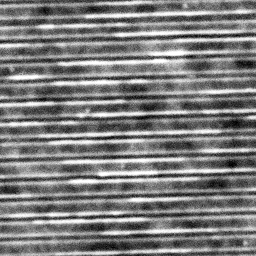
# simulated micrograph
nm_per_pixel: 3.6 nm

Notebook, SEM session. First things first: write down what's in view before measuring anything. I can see parallel lines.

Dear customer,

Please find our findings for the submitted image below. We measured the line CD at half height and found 0.0518 micrometres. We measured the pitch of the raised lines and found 0.071 µm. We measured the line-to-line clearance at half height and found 19.8 nm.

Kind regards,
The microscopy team